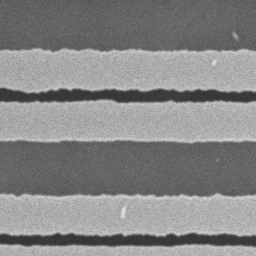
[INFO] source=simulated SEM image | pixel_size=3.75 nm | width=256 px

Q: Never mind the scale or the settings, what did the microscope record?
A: lines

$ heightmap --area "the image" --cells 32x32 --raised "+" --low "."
................................
................................
................................
................................
................................
................................
++++++++++++++++++++++++++++++++
++++++++++++++++++++++++++++++++
++++++++++++++++++++++++++++++++
++++++++++++++++++++++++++++++++
++++++++++++++++++++++++++++++++
...+++..........................
................................
++++++++++++++++++++++++++++++++
++++++++++++++++++++++++++++++++
++++++++++++++++++++++++++++++++
++++++++++++++++++++++++++++++++
++.+++++++++++...+++++++++++++++
................................
................................
................................
................................
................................
................................
++.+++...++.+++++++...+....+...+
++++++++++++++++++++++++++++++++
++++++++++++++++++++++++++++++++
++++++++++++++++++++++++++++++++
++++++++++++++++++++++++++++++++
............+...................
................................
++++++++++++++++++++++++++++++++